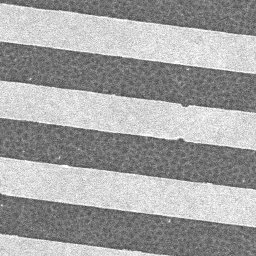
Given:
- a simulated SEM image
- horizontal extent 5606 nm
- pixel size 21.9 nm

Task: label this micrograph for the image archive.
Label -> one or a few lines or trenches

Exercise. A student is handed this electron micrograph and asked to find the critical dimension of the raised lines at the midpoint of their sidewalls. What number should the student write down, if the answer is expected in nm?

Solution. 782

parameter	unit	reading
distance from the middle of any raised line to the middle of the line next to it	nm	1660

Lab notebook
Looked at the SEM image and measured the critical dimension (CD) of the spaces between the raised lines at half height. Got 877 nm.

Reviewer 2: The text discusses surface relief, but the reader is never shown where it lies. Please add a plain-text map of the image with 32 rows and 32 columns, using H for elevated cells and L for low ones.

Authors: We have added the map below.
LLLLLLLLLLLLLLLLLLLLLLLLLLLLLLLL
HHHHHHHHLLLLLLLLLLLLLLLLLLLLLLLL
HHHHHHHHHHHHHHHHLLLLLLLLLLLLLLLL
HHHHHHHHHHHHHHHHHHHHHHHHLLLLLLLL
HHHHHHHHHHHHHHHHHHHHHHHHHHHHHHHH
LLLHHHHHHHHHHHHHHHHHHHHHHHHHHHHH
LLLLLLLLLLLHHHHHHHHHHHHHHHHHHHHH
LLLLLLLLLLLLLLLLLLLHHHHHHHHHHHHH
LLLLLLLLLLLLLLLLLLLLLLLLLLLHHHHH
LLLLLLLLLLLLLLLLLLLLLLHLLLLLLLLL
HHHLLLLLLLLLLLLLLLLLLLLLLLLLLLLL
HHHHHHHHHHHLLLLLLLLLLLLLLLLLLLLL
HHHHHHHHHHHHHHHHHHHLLLLLLLLLLLLL
HHHHHHHHHHHHHHHHHHHHHHHHHHHLLLLL
HHHHHHHHHHHHHHHHHHHHHHHHHHHHHHHH
LLLLLLLHHHHHHHHHHHHHHHHHHHHHHHHH
LLLLLLLLLLLLLLHHHHHHHHHHHHHHHHHH
LLLLLLLLLLLLLLLLLLLLLLLHHHHHHHHH
LLLLLLLLLLLLLLLLLLLLLLLLLLLLLLLH
LLLLLLLLLLLLLLLLLLLLLLLLLLLLLLLL
HHHHHHLLLLLLLLLLLLLLLLLLLLLLLLLL
HHHHHHHHHHHHHHLLLLLLLLLLLLLLLLLL
HHHHHHHHHHHHHHHHHHHHHHLLLLLLLLLL
HHHHHHHHHHHHHHHHHHHHHHHHHHHHHHLL
LLHHHHHHHHHHHHHHHHHHHHHHHHHHHHHH
LLLLLLLLLLHHHHHHHHHHHHHHHHHHHHHH
LLLLLLLLLLLLLLLLLHHHHHHHHHHHHHHH
LLLLLLLLLLLLLLLLLLLLLLLLLHHHHHHH
LLLLLLLLLLLLLLLLLLLLLLLLLLLLLLLL
HHLLLLLLLLLLLLLLLLLLLLLLLLLLLLLL
HHHHHHHHHLLLLLLLLLLLLLLLLLLLLLLL
HHHHHHHHHHHHHHHHHHLLLLLLLLLLLLLL